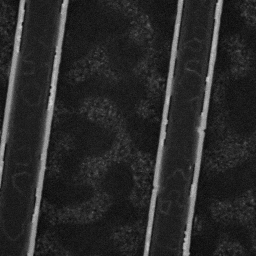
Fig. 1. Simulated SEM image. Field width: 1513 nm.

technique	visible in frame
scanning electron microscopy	one or a few lines or trenches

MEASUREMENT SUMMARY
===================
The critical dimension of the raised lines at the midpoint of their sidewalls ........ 235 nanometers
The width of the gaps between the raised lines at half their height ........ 670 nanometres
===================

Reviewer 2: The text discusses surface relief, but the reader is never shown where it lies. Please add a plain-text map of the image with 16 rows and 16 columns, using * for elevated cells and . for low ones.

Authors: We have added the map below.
.***.......***..
.***.......***..
.***.......**...
.***.......**...
.**........**...
.**........**...
.**.......***...
***.......***...
***.......***...
***.......**....
***.......**....
***.......**....
**........**....
**.......***....
**.......***....
**.......***....